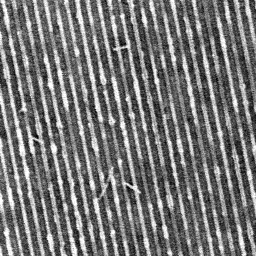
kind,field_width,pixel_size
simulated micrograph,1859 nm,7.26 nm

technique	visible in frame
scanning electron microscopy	parallel lines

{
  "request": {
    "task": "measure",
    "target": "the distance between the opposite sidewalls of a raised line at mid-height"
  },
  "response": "25.8 nm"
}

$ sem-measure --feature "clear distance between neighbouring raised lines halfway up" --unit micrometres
0.0525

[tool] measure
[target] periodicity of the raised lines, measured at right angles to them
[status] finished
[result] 75.3 nanometres